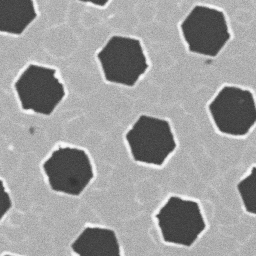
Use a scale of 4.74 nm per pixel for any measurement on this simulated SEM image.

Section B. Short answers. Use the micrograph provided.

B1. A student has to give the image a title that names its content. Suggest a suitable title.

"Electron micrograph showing holes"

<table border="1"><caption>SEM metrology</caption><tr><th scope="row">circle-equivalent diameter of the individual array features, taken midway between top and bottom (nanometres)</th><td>225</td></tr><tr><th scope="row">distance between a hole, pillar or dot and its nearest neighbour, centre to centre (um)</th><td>0.408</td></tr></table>